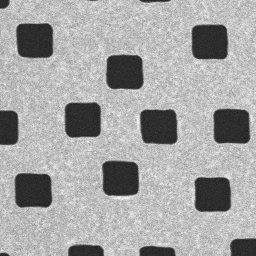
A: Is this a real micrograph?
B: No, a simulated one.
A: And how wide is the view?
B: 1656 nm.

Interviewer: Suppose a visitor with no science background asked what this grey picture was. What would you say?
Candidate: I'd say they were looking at a regular array of holes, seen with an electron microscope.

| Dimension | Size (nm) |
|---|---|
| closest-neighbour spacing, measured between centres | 455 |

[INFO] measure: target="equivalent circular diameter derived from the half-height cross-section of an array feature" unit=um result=0.251